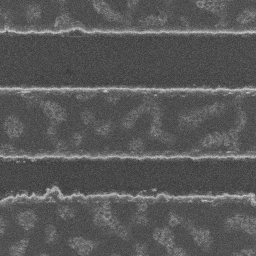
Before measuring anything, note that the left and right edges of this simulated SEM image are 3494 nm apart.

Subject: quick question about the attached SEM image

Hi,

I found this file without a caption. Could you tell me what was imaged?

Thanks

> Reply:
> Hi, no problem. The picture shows one or a few lines or trenches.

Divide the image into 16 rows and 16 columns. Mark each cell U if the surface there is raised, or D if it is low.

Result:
UUUUUUUUUUUUUUUU
UUUUUUUUUUUUUUUU
DDDDDDDDDDDDDDDD
DDDDDDDDDDDDDDDD
DDDDDDDDDDDDDDDD
DDDDDDUDDDDDDDDD
UUUUUUUUUUUUUUUU
UUUUUUUUUUUUUUUU
UUUUUUUUUUUUUUUU
UUUUUUUUUUUUUUUU
DDDDDDDDDDDDDDDD
DDDDDDDDDDDDDDDD
UUUUUUUUUUUUUUUU
UUUUUUUUUUUUUUUU
UUUUUUUUUUUUUUUU
UUUUUUUUUUUUUUUU